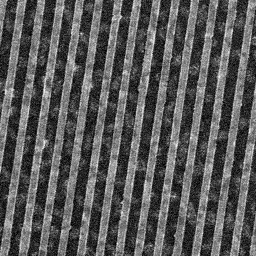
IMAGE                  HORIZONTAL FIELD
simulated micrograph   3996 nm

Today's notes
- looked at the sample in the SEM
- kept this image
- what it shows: parallel lines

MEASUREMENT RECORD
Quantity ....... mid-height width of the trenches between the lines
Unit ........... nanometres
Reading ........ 183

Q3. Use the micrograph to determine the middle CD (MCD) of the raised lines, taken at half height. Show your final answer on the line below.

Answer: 112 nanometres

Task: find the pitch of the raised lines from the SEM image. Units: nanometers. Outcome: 296